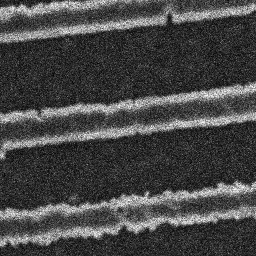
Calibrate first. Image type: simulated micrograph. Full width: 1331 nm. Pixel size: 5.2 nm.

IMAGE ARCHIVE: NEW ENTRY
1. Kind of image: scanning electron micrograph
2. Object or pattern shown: one or a few lines or trenches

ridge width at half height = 144 nm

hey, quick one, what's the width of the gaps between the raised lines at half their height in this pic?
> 0.384 um